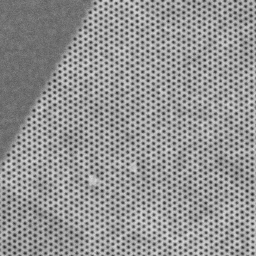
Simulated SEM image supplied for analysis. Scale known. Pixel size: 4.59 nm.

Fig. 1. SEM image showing a regular array of holes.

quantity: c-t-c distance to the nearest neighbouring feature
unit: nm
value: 25.9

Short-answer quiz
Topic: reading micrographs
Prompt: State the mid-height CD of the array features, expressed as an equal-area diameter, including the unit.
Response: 14.6 nm